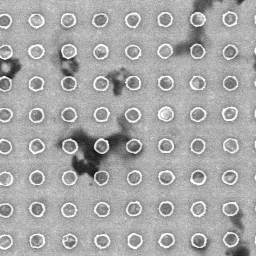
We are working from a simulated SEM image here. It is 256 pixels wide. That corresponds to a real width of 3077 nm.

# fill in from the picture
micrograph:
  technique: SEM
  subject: a regular array of raised bodies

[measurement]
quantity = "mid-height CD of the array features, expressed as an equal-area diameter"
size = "0.166 µm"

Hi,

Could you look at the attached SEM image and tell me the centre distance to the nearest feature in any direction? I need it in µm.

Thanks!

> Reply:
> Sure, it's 0.376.